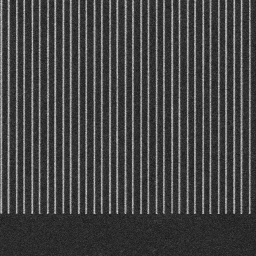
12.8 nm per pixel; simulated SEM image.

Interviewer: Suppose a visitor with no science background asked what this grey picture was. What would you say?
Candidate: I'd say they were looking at parallel lines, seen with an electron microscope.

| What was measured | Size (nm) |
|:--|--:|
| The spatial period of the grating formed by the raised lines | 99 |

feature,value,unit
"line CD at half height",0.0144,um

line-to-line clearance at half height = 83.8 nm